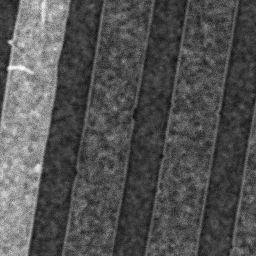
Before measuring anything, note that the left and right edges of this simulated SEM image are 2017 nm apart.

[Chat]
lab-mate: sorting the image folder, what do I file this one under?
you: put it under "one or a few lines or trenches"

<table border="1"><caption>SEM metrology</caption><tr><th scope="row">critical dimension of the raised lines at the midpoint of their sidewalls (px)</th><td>48.3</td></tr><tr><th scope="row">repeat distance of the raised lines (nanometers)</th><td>653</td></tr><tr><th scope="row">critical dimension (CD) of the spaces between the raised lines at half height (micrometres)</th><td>0.273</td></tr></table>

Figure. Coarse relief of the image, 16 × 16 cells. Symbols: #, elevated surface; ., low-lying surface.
.###..####..###.
.###..###...###.
.###..###..###..
.###..###..###..
.###..###..###..
###...###..###..
###...##...###..
###..###...###..
###..###..###...
###..###..###..#
###..###..###..#
##...###..###..#
##..####..###..#
##..###...###..#
##..###..###...#
##..###..###...#